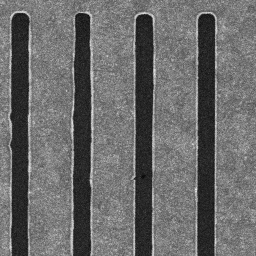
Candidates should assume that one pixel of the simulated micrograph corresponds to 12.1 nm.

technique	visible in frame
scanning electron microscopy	one or a few lines or trenches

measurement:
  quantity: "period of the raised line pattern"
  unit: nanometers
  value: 751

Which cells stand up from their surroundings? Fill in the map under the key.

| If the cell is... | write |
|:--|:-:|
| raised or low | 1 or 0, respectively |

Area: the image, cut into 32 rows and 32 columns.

11111111111111111111111111111111
11011111111111111111111111111111
10001111100111111001111110011111
10001111100111111001111110011111
10001111100111111001111110011111
10001111100111111001111110011111
10001111100111111001111110011111
10001111100111111001111110011111
10001111100111111001111110011111
10001111100111111001111110011111
10001111100011111001111110011111
10001111100011111001111110011111
10001111100011111001111110011111
10001111100011111001111110011111
10001111100011111001111110011111
10001111100011111001111110011111
10001111100011111001111110011111
10001111100011111001111110011111
10001111100111111001111110011111
10001111100111111001111110011111
10001111100111111001111110011111
10001111100111111001111110011111
10001111100111111001111110011111
10001111100111111001111110011111
10001111100111111001111110011111
10001111100111111001111110011111
10001111100111111001111100011111
10001111100111111001111100011111
10001111100111111001111100011111
10001111100111111001111100011111
10001111100111111001111100011111
10001111100111111001111100011111